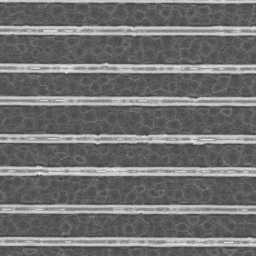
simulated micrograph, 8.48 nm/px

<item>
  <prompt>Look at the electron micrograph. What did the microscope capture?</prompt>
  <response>parallel lines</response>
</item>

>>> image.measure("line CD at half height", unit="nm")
58.3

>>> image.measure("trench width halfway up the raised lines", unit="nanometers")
225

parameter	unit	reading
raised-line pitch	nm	298